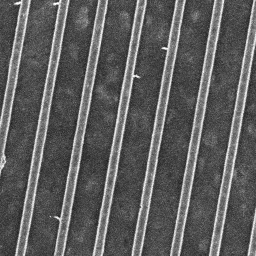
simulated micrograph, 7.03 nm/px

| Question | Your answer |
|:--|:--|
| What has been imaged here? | parallel lines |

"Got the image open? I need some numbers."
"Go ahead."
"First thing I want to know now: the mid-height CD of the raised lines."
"0.0606 microns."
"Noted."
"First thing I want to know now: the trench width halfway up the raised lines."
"210 nm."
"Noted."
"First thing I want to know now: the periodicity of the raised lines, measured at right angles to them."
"0.268 um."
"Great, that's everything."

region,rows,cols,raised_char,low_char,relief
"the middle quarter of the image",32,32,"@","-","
------@@--------@@-------@@-----
------@@--------@--------@@-----
------@@-------@@--------@@-----
-----@@@-------@@--------@@-----
-----@@--------@@--------@@-----
-----@@--------@@-------@@@-----
-----@@-------@@@-------@@------
-----@@-------@@--------@@------
-----@@-------@@--------@@------
----@@@-------@@--------@@------
----@@--------@@--------@@------
----@@--------@@-------@@-------
----@@--------@@-------@@-------
----@@--------@--------@@-------
----@@-------@@--------@@-------
---@@--------@@--------@@-------
---@@--------@@--------@@-------
---@@--------@@-------@@--------
---@@--------@--------@@--------
---@@-------@@--------@@--------
---@--------@@--------@@--------
--@@--------@@--------@@-------@
--@@--------@@-------@@--------@
--@@--------@@-------@@--------@
--@@-------@@--------@@--------@
--@@-------@@--------@@--------@
-@@@-------@@--------@@--------@
-@@--------@@--------@@-------@@
-@@--------@@-------@@@-------@@
-@@--------@@-------@@--------@@
-@@--------@--------@@--------@@
-@@-------@@--------@@--------@@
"